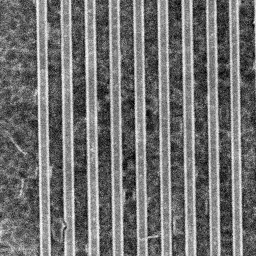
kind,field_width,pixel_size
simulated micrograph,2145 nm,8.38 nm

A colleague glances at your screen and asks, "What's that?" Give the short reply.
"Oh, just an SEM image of parallel lines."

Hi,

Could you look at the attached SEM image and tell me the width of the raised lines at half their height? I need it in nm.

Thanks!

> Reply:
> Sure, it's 67.1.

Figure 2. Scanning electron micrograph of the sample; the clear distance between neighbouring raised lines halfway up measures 0.134 microns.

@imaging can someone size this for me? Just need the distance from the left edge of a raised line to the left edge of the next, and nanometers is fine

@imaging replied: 202